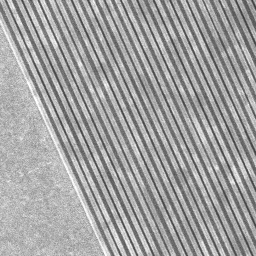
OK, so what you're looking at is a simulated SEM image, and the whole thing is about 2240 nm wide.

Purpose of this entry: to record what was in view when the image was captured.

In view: parallel lines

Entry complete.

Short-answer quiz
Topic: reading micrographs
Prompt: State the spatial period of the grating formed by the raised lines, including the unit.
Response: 7.51 px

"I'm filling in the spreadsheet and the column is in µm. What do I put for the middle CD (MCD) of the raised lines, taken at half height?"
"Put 0.0389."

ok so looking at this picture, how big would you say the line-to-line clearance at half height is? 0.031 µm